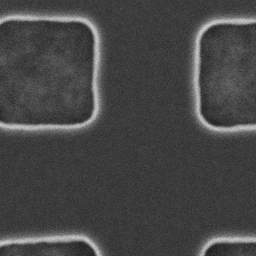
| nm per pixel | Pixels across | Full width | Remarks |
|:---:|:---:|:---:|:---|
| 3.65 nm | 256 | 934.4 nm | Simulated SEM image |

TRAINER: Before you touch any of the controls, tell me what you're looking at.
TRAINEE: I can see holes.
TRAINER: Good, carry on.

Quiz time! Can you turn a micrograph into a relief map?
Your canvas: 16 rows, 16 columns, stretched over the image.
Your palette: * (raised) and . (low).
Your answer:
****************
.....********...
......******....
......******....
......******....
......******....
......******....
.....********...
****************
****************
****************
****************
****************
****************
****************
......*******...